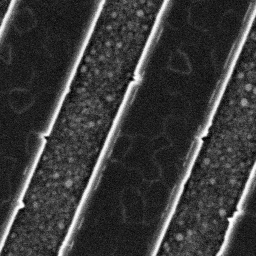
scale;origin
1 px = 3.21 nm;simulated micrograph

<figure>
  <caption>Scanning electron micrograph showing one or a few lines or trenches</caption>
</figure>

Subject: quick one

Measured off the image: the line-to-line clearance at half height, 0.182 micrometres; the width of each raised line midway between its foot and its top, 280 nm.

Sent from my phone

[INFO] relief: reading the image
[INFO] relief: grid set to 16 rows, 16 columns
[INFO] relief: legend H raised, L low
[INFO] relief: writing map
LHHHHHLLLLHHHHHH
HHHHHHLLLLHHHHHH
HHHHHHLLLHHHHHHL
HHHHHLLLLHHHHHHL
HHHHHLLLLHHHHHLL
HHHHLLLLHHHHHHLL
HHHHLLLLHHHHHHLL
HHHLLLLHHHHHHLLL
HHHLLLLHHHHHHLLL
HHHLLLHHHHHHLLLL
HHLLLLHHHHHHLLLL
HHLLLLHHHHHLLLLH
HLLLLHHHHHHLLLLH
HLLLLHHHHHHLLLLH
HLLLHHHHHHLLLLHH
LLLLHHHHHHLLLLHH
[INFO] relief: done